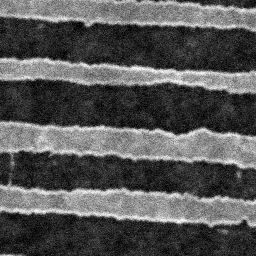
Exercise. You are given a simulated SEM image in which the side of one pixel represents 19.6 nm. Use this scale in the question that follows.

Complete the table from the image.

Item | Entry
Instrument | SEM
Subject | one or a few lines or trenches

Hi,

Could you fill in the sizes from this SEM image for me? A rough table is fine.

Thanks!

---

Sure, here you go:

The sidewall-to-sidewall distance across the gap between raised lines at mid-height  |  849 nm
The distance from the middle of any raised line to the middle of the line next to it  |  64.6 px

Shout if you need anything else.